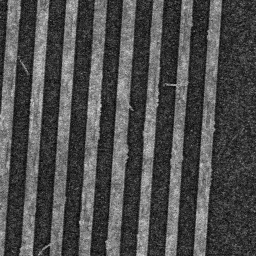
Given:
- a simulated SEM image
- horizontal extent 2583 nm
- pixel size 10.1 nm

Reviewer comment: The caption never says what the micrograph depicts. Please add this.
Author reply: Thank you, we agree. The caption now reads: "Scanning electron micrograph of parallel lines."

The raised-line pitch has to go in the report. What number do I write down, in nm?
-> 290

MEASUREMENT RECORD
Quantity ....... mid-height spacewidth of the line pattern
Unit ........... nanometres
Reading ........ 178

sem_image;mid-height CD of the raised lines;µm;0.11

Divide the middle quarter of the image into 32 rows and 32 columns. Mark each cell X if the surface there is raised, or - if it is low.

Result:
XX-----XX-----XXX----XXX----XXX-
XX-----XX-----XXX----XXX----XXX-
XX-----XXX----XXX----XXX----XXX-
XX-----XX-----XXX----XXX----XXX-
XX-----XX-----XXX----XXX----XXX-
XX-----XX-----XX-----XX-----XXX-
XX-----XX-----XX-----XX-----XXX-
XX----XXX-----XX-----XXX----XXX-
XX----XXX-----XX-----XXX----XX--
X-----XXX----XXX-----XXX----XX--
X-----XXX----XXXX----XX-----XX--
X-----XXX----XXX-----XX-----XX--
X-----XXX----XXX-----XX-----XX--
X-----XXX----XXX-----XX-----XX--
X-----XXX----XXX----XXX-----XX--
X-----XXX----XXX----XXX-----XX--
X-----XXX----XXX----XXX-----XX--
X-----XXX----XXX----XXX-----XX--
X-----XXX----XXX----XX-----XXX--
X-----XX-----XXX----XX-----XXX--
X-----XX------XX----XX-----XXX--
X-----XX------XX----XX-----XXX--
X----XXX-----XXX----XX-----XXX--
X----XXX-----XXX----XX-----XXX--
X----XXX----XXX-----XX-----XX---
-----XXX----XXX-----XX-----XX---
-----XXX----XXX-----XX-----XX---
-----XXX----XXX-----XX-----XX---
-----XXX----XXX-----XX-----XX---
-----XXX----XXX----XXX-----XX---
-----XX-----XXX----XXX-----XX---
-----XX-----XXX----XXX----XXX---